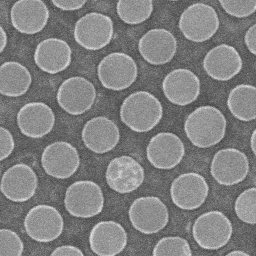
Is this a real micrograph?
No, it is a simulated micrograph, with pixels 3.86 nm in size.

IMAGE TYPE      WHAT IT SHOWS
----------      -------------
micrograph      a regular array of raised bodies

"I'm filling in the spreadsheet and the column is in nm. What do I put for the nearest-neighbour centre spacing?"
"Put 179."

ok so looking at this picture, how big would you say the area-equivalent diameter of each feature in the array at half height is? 0.141 microns